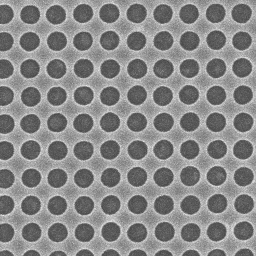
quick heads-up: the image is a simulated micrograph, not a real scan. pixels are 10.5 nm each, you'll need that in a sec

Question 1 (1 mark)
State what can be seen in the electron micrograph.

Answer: a regular array of holes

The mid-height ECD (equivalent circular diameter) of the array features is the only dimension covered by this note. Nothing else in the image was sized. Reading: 213 nm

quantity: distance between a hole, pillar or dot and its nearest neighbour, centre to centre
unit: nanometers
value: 276